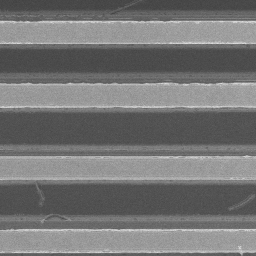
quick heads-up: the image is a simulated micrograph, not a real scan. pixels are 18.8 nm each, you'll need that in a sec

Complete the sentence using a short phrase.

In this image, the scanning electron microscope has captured lines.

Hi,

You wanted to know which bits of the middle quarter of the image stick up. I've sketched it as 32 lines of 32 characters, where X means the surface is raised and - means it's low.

--------------------------------
--------------------------------
--------------------------------
--------------------------------
--------------------------------
XXXXXXXXXXXXXXXXXXXXXXXXXXXXXXXX
XXXXXXXXXXXXXXXXXXXXXXXXXXXXXXXX
XXXXXXXXXXXXXXXXXXXXXXXXXXXXXXXX
XXXXXXXXXXXXXXXXXXXXXXXXXXXXXXXX
XXXXXXXXXXXXXXXXXXXXXXXXXXXXXXXX
XXXXXXXXXXXXXXXXXXXXXXXXXXXXXXXX
--------------------------------
--------------------------------
--------------------------------
--------------------------------
--------------------------------
--------------------------------
--------------------------------
--------------------------------
--------------------------------
--------------------------------
--------------------------------
--------------------------------
XXXXXXXXXXXXXXXXXXXXXXXXXXXXXXXX
XXXXXXXXXXXXXXXXXXXXXXXXXXXXXXXX
XXXXXXXXXXXXXXXXXXXXXXXXXXXXXXXX
XXXXXXXXXXXXXXXXXXXXXXXXXXXXXXXX
XXXXXXXXXXXXXXXXXXXXXXXXXXXXXXXX
XXXXXXXXXXXXXXXXXXXXXXXXXXXXXXXX
--------------------------------
--------------------------------
--------------------------------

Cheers